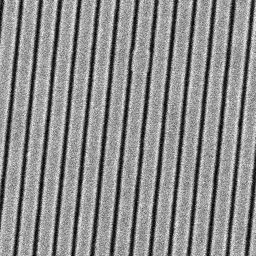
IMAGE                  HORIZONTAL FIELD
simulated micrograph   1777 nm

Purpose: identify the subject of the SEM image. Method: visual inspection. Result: parallel lines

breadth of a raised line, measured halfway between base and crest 91.6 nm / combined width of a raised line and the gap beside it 0.133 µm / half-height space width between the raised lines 38.8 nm